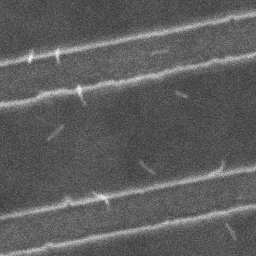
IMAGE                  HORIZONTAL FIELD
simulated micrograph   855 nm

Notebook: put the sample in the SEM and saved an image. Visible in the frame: one or a few lines or trenches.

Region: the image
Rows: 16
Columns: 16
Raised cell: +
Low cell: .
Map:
++++++++++++++++
+++++++++++++...
++++++++........
+++............+
..........++++++
.....+++++++++++
++++++++++++++++
++++++++++++++++
++++++++++++++++
++++++++++++++++
++++++++++++++++
+++++++++++.....
++++++..........
+............+++
........++++++++
..++++++++++++++